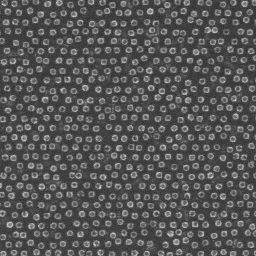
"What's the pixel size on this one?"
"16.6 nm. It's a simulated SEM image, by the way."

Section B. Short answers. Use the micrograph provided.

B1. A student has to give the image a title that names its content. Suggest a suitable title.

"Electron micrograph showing a regular array of raised bodies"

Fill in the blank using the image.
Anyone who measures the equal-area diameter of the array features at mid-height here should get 0.0919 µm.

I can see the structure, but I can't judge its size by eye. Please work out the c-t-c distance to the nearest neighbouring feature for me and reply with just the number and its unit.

154 nanometres